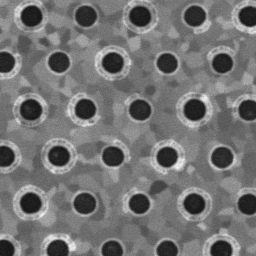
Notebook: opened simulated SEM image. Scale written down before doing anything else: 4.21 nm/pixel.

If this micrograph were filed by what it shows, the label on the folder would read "a regular array of holes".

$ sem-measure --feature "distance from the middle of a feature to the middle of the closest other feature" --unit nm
227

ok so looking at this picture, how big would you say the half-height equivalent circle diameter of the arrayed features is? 95.5 nm